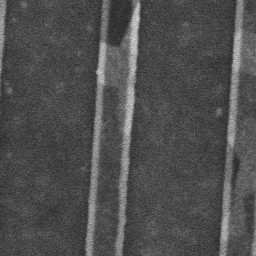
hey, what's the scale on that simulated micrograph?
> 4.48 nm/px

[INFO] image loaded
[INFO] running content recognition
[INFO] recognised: one or a few lines or trenches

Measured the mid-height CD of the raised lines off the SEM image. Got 143 nanometres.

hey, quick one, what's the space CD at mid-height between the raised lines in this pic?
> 0.457 micrometres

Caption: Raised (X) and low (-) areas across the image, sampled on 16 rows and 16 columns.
-------XX------X
------XX-------X
------XX-------X
------XX-------X
------XX-------X
------XX-------X
------XX-------X
------XX------XX
------XX------XX
------XX------XX
------XX------XX
------XX------XX
------XX------XX
------XX------XX
------XX------XX
------X-------XX